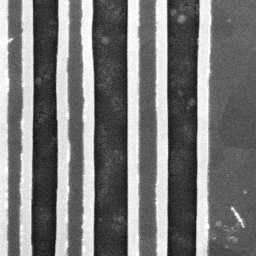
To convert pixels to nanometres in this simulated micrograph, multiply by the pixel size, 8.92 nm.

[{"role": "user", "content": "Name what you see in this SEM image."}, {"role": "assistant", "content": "one or a few lines or trenches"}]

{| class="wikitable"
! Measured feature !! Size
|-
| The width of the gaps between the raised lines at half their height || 360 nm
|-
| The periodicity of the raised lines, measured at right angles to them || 0.593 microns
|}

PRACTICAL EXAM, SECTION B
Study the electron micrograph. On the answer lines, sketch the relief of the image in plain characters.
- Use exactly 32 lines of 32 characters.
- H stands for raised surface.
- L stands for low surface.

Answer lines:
HHHLLLLLHHHLLLLLLHHHLLLLLLHHHHHH
HHHLLLLLHHHLLLLLLHHHLLLLLLHHHHHH
HHHLLLLLHHHLLLLLLHHHLLLLLLHHHHHH
HHHLLLLLHHHLLLLLLHHHLLLLLLHHHHHH
HHHLLLLLHHHLLLLLLHHHLLLLLLHHHHHH
HHHLLLLLHHHLLLLLLHHHLLLLLLHHHHHH
HHHLLLLLHHHLLLLLLHHHLLLLLLHHHHHH
HHHLLLLLHHHLLLLLLHHHLLLLLHHHHHHH
HHHLLLLLHHHLLLLLLHHHLLLLLHHHHHHH
HHHLLLLLHHHLLLLLLHHHLLLLLHHHHHHH
HHHLLLLLHHHLLLLLLHHHLLLLLHHHHHHH
HHHLLLLLHHHLLLLLLHHHLLLLLHHHHHHH
HHHLLLLLHHHLLLLLLHHHLLLLLHHHHHHH
HHHLLLLLHHHLLLLLLHHHLLLLLHHHHHHH
HHHLLLLLHHHLLLLLLHHHLLLLLHHHHHHH
HHHLLLLLHHHLLLLLLHHHLLLLLHHHHHHH
HHHLLLLLHHHLLLLLLHHHLLLLLHHHHHHH
HHHLLLLLHHHLLLLLLHHHLLLLLHHHHHHH
HHHLLLLLHHHLLLLLLHHHLLLLLHHHHHHH
HHHLLLLLHHHLLLLLLHHHLLLLLHHHHHHH
HHHLLLLLHHHLLLLLLHHHLLLLLHHHHHHH
HHHLLLLLHHHLLLLLLHHHLLLLLHHHHHHH
HHHLLLLLHHHLLLLLLHHHLLLLLHHHHHHH
HHHLLLLLHHHLLLLLLHHHLLLLLHHHHHHH
HHHLLLLLHHHLLLLLLHHHLLLLLHHHHHHH
HHHLLLLLHHHLLLLLLHHHLLLLLHHHHHHH
HHHLLLLLHHHLLLLLLHHHLLLLLHHHHHHH
HHHLLLLLHHHLLLLLLHHHLLLLLHHHHHHH
HHHLLLLLHHHLLLLLLHHHLLLLLHHHHHHH
HHHLLLLLHHHLLLLLLHHHLLLLLHHHHHHH
HHHLLLLLHHHLLLLLLHHHLLLLLHHHHHHH
HHHLLLLLHHHLLLLLLHHHLLLLLHHHHHHH